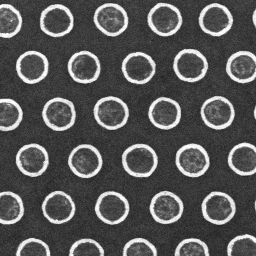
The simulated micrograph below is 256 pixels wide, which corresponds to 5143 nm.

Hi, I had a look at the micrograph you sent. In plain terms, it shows a regular array of raised bodies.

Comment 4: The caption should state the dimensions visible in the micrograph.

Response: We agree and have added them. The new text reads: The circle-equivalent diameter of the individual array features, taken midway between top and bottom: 0.608 micrometres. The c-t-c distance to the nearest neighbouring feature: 52.2 pixels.